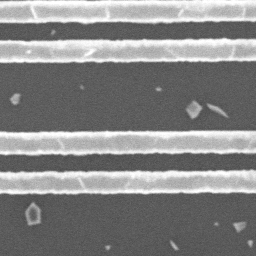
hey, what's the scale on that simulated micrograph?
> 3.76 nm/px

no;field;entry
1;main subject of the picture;lines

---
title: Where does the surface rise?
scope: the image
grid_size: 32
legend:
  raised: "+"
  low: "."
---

++++++++++++++++++++++++++++++++
++++++++++++++++++++++++++++++++
++++++++++++++++++++++++++++++++
................................
................................
++++++++++++++++++++++++++++++++
++++++++++++++++++++++++++++++++
++++++++++++++++++++++++++++....
................................
................................
................................
................................
................................
........................+.......
................................
................................
................................
++++++++++++++++++++++++++++++++
++++++++++++++++++++++++++++++++
................................
................................
................................
++++++++++++++++++++++++++++++++
++++++++++++++++++++++++++++++++
................................
................................
...++...........................
...++...........................
................................
................................
................................
................................